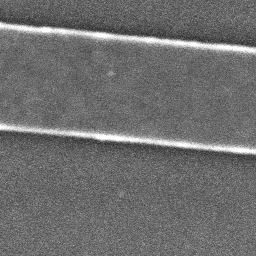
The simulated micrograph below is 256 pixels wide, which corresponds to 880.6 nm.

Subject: one or a few lines or trenches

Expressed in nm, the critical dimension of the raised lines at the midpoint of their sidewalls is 360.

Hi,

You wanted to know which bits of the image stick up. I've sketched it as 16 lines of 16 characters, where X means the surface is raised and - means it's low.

----------------
----------------
XXXXXXXXXX------
XXXXXXXXXXXXXXXX
XXXXXXXXXXXXXXXX
XXXXXXXXXXXXXXXX
XXXXXXXXXXXXXXXX
XXXXXXXXXXXXXXXX
-----XXXXXXXXXXX
---------------X
----------------
----------------
----------------
----------------
----------------
----------------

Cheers